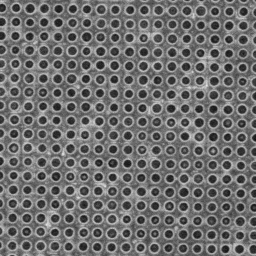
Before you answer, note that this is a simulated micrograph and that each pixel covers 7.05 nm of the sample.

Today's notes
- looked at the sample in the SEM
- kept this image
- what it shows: a regular array of holes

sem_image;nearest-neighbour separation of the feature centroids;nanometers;97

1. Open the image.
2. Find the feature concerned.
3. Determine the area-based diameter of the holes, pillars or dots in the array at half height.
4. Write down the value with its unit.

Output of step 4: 63.2 nm